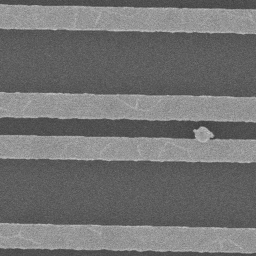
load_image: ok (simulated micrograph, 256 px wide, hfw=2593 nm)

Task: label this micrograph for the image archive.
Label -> lines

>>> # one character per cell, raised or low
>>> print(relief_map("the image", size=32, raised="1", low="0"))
00000000000000000000000000000000
11111111111111111111111111111111
11111111111111111111111111111111
11111111111111111111111111111111
00000000000000000000000000000000
00000000000000000000000000000000
00000000000000000000000000000000
00000000000000000000000000000000
00000000000000000000000000000000
00000000000000000000000000000000
00000000000000000000000000000000
00000000000000000000000000000000
11111111111111111111111111111111
11111111111111111111111111111111
11111111111111111111111111111111
00000000000000000000000000000000
00000000000000000000000011000000
11111111111111111111111111110000
11111111111111111111111111111111
11111111111111111111111111111111
00000000000000000000000000000000
00000000000000000000000000000000
00000000000000000000000000000000
00000000000000000000000000000000
00000000000000000000000000000000
00000000000000000000000000000000
00000000000000000000000000000000
00000000000000000000000000000000
11111111111111111111111100000000
11111111111111111111111111111111
11111111111111111111111111111111
00000000000000000000000001111111